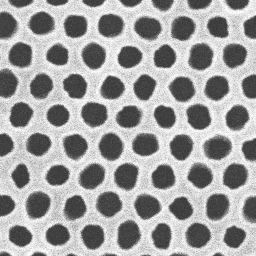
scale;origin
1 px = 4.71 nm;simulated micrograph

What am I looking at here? a regular array of holes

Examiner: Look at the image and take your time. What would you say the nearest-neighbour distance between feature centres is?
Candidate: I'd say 158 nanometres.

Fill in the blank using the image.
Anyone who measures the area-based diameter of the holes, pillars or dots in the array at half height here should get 0.113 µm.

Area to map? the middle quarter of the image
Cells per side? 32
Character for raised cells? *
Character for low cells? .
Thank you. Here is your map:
******...*****....*****....*****
********************************
**.*****************.***********
.....*****....*****...******...*
.....*****.....***.....****.....
......***......**......***......
.....****......**......***......
*....*****....****....*****.....
**..******...******..*******....
********************************
*****.....******..******.*******
.***.......***.....****....****.
.***.......**......***......***.
.***.......**......****.....***.
.****.....***......****.....***.
*******..*****....******...*****
********************************
***********.*******..********.**
.....****.....****.....****.....
......***......**......****.....
......***......**......****.....
......***......**......****.....
*....****.....****....*****....*
*...******....**************...*
********************************
******...*****....*****...******
.****.....***.....*****....****.
.***......**......****......***.
.***......**......****......***.
****.....****.....****......****
****....******....*****....*****
***************..***************